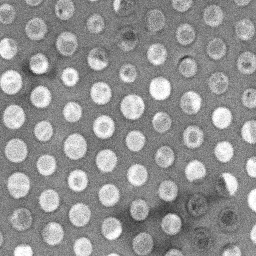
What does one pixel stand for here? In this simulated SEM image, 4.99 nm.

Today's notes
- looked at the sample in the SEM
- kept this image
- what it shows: a regular array of raised bodies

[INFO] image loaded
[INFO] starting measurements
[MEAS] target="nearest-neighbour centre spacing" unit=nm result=167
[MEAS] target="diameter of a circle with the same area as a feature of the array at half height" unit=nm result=99.5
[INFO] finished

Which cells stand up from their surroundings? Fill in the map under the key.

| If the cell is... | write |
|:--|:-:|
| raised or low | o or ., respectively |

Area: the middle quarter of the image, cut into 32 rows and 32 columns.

.......ooo.....oo............ooo
oo............oooo...........ooo
ooo...........oooo............oo
ooo...........oooo..............
ooo.............o.....oooo......
.......oooo...........oooo......
.......oooo...........oooo......
.......ooooo..........oooo....oo
.......oooo....oooo....oo.....oo
........ooo....ooooo.........ooo
oooo..........oooooo.........ooo
oooo..........oooooo..........oo
oooo...........oooo....oo.......
oooo.....oo.....oo.....ooo......
........oooo..........ooooo.....
.......ooooo..........oooo......
........oooo...........ooo....oo
........oooo....ooo...........oo
.oooo...........oooo..........oo
ooooo...........oooo..........oo
oooooo..........oooo...........o
ooooo............oo.....ooo.....
.oooo....oooo..........oooo.....
..oo....ooooo..........oooo.....
........ooooo..........oooo.....
........ooooo.....o.....oo.....o
..........oo....oooo...........o
..ooo...........ooooo..........o
.ooooo..........ooooo..........o
.ooooo...........ooo.....oo.....
..ooo.....oo............oooo....
..oo.....oooo...........oooo....